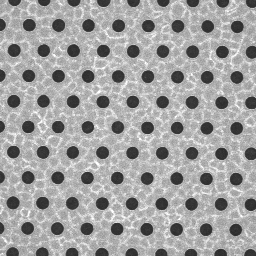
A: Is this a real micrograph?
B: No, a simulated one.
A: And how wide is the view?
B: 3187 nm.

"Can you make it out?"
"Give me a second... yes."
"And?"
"a regular array of holes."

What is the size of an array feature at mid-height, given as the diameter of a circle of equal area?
0.158 µm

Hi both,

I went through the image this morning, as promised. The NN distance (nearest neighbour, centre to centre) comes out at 364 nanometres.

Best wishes